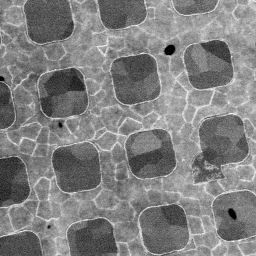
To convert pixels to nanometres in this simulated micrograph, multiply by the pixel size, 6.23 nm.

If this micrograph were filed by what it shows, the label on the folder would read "raised bodies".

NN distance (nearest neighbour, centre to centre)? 462 nanometers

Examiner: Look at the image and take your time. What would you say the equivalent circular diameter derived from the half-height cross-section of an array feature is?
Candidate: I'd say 0.325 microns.